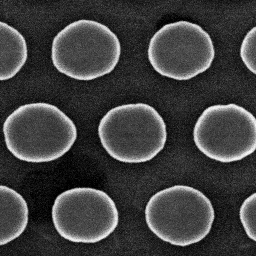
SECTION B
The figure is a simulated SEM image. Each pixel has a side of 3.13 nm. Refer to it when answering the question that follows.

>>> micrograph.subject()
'raised bodies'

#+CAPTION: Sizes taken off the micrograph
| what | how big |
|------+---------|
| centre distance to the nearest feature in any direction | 295 nm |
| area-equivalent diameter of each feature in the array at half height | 61.7 pixels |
